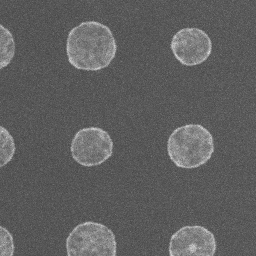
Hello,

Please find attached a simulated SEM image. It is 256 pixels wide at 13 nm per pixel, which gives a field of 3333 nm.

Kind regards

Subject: raised bodies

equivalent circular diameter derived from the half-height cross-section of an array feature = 537 nanometers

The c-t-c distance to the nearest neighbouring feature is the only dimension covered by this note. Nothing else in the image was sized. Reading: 1290 nanometers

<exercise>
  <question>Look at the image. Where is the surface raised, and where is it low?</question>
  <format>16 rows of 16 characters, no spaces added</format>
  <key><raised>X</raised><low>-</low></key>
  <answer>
----------------
-----X----------
X---XXX----XX---
X---XXX----XX---
----------------
----------------
----------------
----------------
X----XX----XX---
X----XX----XX---
----------------
----------------
----------------
----------------
-----XX----XX---
X---XXX----XX---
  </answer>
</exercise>